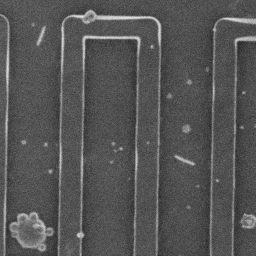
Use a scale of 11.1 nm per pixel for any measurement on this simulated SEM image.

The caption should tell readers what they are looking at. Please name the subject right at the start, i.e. groups of lines, slits or small figures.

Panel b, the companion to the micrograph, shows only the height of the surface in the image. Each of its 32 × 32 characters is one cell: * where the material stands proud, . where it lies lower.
................................
...........*....................
*.......***********.........*...
*.......************.......*****
*.......************.......*****
*.......***......***.......**...
*.......***......***.......**...
*.......**.......***.......**...
*.......***......***.......**...
*.......***......***.......**...
*.......**.......***.......**...
*.......**.......***.......**...
*.......**.......***.......**...
*.......**.......***.......**...
*.......**.......***.......**...
*.......**.......***.......**...
*.......**.......***.......**...
*.......**.......***.......**...
*.......**.......***.......**...
*.......**.......***.......**...
*.......**.......***.......**...
*.......**.......***.......**...
*......***.......***.......**...
*......***.......***......***...
*......***.......***......***...
*......***.......***......***...
*......***.......***......***...
*.***..***.......***......***...
*.****.***.......***......***...
*.****.***.......***......***...
*..**..***.......***......***...
*......***.......***......***...